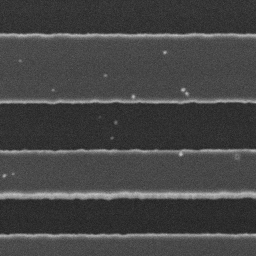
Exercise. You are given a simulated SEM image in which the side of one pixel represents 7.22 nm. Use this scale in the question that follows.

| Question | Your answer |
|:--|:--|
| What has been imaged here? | lines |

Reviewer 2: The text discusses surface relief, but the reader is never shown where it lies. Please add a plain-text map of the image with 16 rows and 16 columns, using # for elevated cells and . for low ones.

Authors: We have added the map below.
................
................
################
################
################
################
................
................
................
################
################
################
................
................
................
################